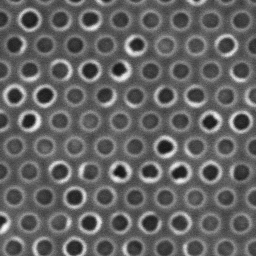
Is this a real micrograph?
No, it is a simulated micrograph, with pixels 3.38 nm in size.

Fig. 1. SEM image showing a regular array of holes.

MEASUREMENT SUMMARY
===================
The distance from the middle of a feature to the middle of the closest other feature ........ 98.3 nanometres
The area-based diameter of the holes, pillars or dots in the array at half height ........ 57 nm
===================